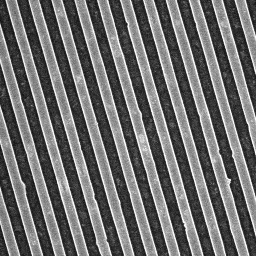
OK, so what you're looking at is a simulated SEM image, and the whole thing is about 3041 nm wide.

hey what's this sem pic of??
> parallel lines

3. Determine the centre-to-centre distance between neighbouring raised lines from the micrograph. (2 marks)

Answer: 22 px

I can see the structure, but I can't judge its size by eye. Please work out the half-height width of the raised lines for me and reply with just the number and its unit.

126 nanometers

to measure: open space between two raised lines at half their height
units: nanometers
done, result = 137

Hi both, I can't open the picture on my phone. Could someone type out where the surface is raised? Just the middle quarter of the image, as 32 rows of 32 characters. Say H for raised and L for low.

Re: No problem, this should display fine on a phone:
LLHHLLLHHHLLLHHLLLLHHLLLHHHLLLHH
LLHHLLLLHHLLLHHHLLLHHHLLLHHLLLHH
LLHHHLLLHHLLLLHHLLLHHHLLLHHHLLLH
LLHHHLLLHHHLLLHHLLLLHHLLLHHHLLLH
LLLHHLLLHHHLLLHHHLLLHHLLLLHHLLLH
LLLHHHLLLHHLLLHHHLLLHHHLLLHHHLLL
LLLHHHLLLHHHLLLHHLLLHHHLLLHHHLLL
LLLHHHLLLHHHLLLHHHLLLHHLLLHHHLLL
HLLLHHLLLHHHLLLHHHLLLHHHLLLHHLLL
HLLLHHHLLLHHLLLLHHLLLHHHLLLHHHLL
HLLLHHHLLLHHHLLLHHLLLLHHLLLHHHLL
HHLLLHHLLLHHHLLLHHHLLLHHHLLLHHLL
HHLLLHHHLLLHHLLLHHHLLLHHHLLLHHHL
HHLLLHHHLLLHHHLLLHHLLLHHHLLLHHHL
HHLLLLHHLLLHHHLLLHHHLLLHHLLLHHHL
HHHLLLHHLLLLHHLLLHHHLLLHHHLLLHHL
HHHLLLHHHLLLHHLLLLHHLLLHHHLLLHHH
LHHLLLLHHLLLHHHLLLHHLLLLHHLLLHHH
LHHHLLLHHLLLLHHLLLHHHLLLHHLLLLHH
LHHHLLLHHHLLLHHLLLHHHLLLHHHLLLHH
LLHHLLLHHHLLLHHLLLLHHLLLLHHLLLHH
LLHHLLLHHHLLLHHHLLLHHHLLLHHLLLLH
LLHHHLLLHHLLLLHHLLLHHHLLLHHHLLLH
LLLHHLLLHHHLLLHHLLLLHHLLLHHHLLLH
LLLHHLLLHHHLLLHHLLLLHHLLLHHHLLLH
LLLHHHLLLHHLLLLHHLLLHHHLLLHHLLLH
LLLHHHLLLHHHLLLHHLLLLHHLLLHHHLLL
LLLLHHLLLHHHLLLHHHLLLHHLLLHHHLLL
HLLLHHLLLHHHLLLHHHLLLHHHLLLHHLLL
HLLLHHHLLLHHLLLLHHLLLHHHLLLHHHLL
HLLLLHHLLLHHHLLLHHLLLHHHLLLHHHLL
HHLLLHHLLLHHHLLLHHHLLLHHLLLHHHLL